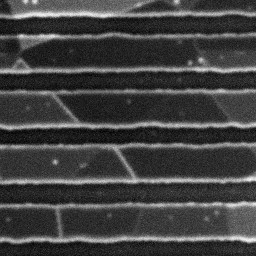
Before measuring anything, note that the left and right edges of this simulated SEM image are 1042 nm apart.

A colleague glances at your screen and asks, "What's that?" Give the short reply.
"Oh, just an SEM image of lines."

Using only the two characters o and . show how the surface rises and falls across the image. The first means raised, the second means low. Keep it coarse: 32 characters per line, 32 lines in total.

oooooooooooooooooooooooooooooooo
oooooooooooooooooooooooooooooooo
................................
................................
..o..oo....oooooo..ooooooooooooo
oooooooooooooooooooooooooooooooo
oooooooooooooooooooooooooooooooo
oooooooooooooooooooooooooooooooo
oooooooooooooooooooooooooooooooo
................................
................................
oooooooooooooooooooooooooooooooo
oooooooooooooooooooooooooooooooo
oooooooooooooooooooooooooooooooo
oooooooooooooooooooooooooooooooo
oooooooooooooooooooooooooooooooo
................................
................................
oooooooooooooooooooooooooooooooo
oooooooooooooooooooooooooooooooo
oooooooooooooooooooooooooooooooo
oooooooooooooooooooooooooooooooo
oooooooooooooooooooooooooooooooo
................................
................................
...............oo......oo.oo..oo
oooooooooooooooooooooooooooooooo
oooooooooooooooooooooooooooooooo
oooooooooooooooooooooooooooooooo
oooooooooooooooooooooooooooooooo
................................
................................